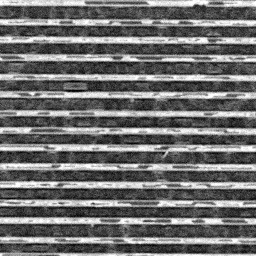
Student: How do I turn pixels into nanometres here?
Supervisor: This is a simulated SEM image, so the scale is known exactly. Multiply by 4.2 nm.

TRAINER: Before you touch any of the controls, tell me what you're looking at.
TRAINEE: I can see parallel lines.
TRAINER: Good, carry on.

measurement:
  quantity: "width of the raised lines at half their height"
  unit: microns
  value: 0.0252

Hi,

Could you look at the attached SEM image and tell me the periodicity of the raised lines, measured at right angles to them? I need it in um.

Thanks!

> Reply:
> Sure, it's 0.0763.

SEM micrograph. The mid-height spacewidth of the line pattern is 51.4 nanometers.